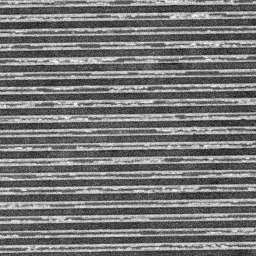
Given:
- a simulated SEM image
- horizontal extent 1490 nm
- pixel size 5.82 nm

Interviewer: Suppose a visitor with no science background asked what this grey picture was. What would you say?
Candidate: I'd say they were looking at parallel lines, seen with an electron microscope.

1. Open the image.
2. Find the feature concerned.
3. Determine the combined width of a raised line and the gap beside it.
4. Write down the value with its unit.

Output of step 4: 83.9 nm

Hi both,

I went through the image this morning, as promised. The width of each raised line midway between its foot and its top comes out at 34.9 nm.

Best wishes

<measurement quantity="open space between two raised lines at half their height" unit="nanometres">50.2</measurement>